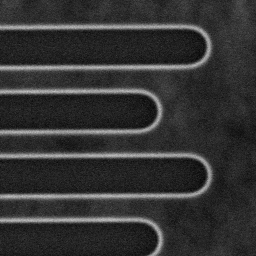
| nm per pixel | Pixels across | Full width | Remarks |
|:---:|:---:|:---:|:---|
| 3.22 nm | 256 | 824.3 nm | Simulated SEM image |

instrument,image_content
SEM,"groups of lines, slits or small figures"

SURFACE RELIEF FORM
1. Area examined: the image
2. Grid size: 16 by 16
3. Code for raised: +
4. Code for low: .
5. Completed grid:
++++++++++++++++
++++++++++++++++
.............+++
.............+++
++++++++++++++++
++++++++++++++++
..........++++++
..........++++++
++++++++++++++++
++++++++++++++++
.............+++
.............+++
++++++++++++++++
++++++++++++++++
..........++++++
..........++++++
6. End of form